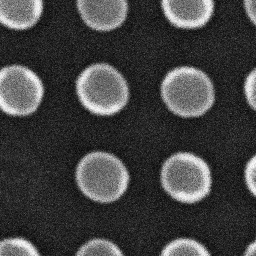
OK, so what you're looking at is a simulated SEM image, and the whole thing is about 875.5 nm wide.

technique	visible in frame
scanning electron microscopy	raised bodies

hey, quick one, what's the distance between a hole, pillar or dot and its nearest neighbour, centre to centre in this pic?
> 290 nanometers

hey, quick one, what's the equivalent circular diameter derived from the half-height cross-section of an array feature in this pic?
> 0.166 microns